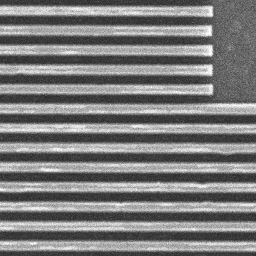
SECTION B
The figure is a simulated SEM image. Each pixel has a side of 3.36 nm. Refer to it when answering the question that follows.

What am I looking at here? parallel lines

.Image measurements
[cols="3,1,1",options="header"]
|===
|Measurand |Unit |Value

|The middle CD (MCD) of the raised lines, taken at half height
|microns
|0.0294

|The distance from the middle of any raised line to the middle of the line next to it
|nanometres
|65.8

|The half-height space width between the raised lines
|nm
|35.3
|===